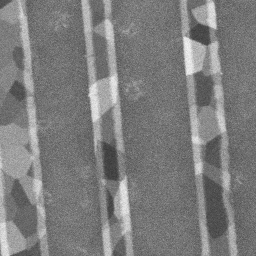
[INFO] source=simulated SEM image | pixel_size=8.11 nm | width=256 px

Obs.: one or a few lines or trenches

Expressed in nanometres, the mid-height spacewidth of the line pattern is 575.